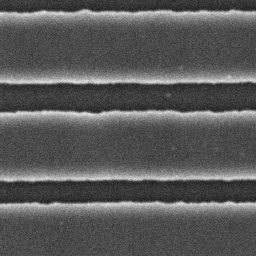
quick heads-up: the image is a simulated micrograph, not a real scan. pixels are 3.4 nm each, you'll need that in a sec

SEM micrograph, lines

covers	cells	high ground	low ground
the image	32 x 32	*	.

................................
.....*....*.......****...*..**..
********************************
********************************
********************************
********************************
********************************
********************************
********************************
********************************
................................
................................
................................
................................
********************************
********************************
********************************
********************************
********************************
********************************
********************************
********************************
************....**.**.......*...
................................
................................
...**..*...*********************
********************************
********************************
********************************
********************************
********************************
********************************